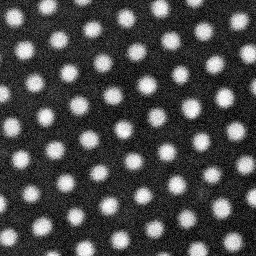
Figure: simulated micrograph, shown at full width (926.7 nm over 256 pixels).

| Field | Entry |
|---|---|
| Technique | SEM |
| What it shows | a regular array of raised bodies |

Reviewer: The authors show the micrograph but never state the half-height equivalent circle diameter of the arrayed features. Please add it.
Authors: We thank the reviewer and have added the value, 57.6 nanometers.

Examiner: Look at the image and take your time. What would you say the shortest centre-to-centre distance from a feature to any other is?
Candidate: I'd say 125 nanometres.